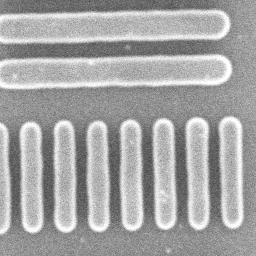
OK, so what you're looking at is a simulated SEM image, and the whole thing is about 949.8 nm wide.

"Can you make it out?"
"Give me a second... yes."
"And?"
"groups of lines, slits or small figures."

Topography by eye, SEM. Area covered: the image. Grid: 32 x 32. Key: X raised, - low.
--------------------------------
------------------XXXXXXXXXX----
XXXXXXXXXXXXXXXXXXXXXXXXXXXXX---
XXXXXXXXXXXXXXXXXXXXXXXXXXXXX---
XXXXXXXXXXXXXXXXXXXXXXXXXXXX----
--------------------------------
--------------------------------
-XXXXXXXXXXXXXXXXXXXXXXXXXXX----
XXXXXXXXXXXXXXXXXXXXXXXXXXXXX---
XXXXXXXXXXXXXXXXXXXXXXXXXXXXX---
XXXXXXXXXXXXXX-XX-XX------------
--------------------------------
--------------------------------
--------------------------------
--------------------------------
---X---XX---X---X---X---XX--XX--
X--XX--XX--XX--XXX-XXX-XXX--XX--
X--XX--XX--XX--XXX-XXX-XXX--XX--
X--XX--XX--XX--XX--XXX-XXX--XX--
X--XX--XX--XX--XXX-XXX--XX--XX--
X--XX--XX--XX--XXX-XXX--XX--XX--
X--XX--XX--XX--XXX-XXX--XX--XX--
X--XX--XX--XXX-XXX-XXX--XX--XX--
X--XX--XX--XXX-XXX-XXX--XX--XX--
X--XX--XX--XX--XXX-XXX--XX--XX--
X--XX--XX--XX--XXX-XXX--XX--XX--
X--XX--XX--XX--XXX--XX--XX--XX--
X--XX--XX--XX--XXX--XX--XX--XX--
X--XX--XX---X---X---------------
--------------------------------
--------------------------------
--------------------------------